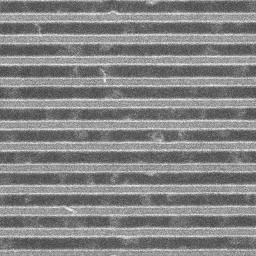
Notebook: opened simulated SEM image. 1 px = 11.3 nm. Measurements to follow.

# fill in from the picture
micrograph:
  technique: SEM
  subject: parallel lines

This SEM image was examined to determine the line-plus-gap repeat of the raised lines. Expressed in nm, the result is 243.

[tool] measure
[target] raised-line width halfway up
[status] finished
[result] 167 nm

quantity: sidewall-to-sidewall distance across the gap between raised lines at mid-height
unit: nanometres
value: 83.4